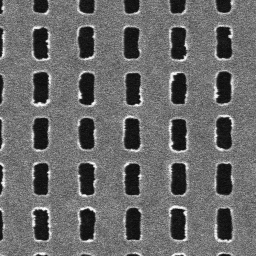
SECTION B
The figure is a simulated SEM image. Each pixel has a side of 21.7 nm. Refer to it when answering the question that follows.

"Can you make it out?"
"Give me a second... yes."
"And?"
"a regular array of holes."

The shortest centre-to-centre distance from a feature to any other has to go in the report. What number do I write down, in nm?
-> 975